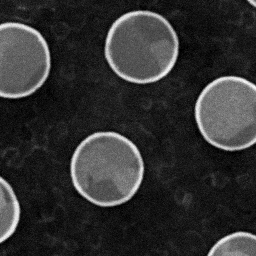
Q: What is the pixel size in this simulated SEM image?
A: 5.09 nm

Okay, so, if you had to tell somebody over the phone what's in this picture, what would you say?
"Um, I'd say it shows raised bodies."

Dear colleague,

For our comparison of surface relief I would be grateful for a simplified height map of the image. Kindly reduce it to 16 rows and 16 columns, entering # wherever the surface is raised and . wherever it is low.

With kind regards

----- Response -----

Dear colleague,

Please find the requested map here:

................
.......###......
###....####.....
###....####.....
###....###......
##...........###
............####
............####
......#......###
.....####.......
.....####.......
.....####.......
#.....##........
#...............
#...............
.............###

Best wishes